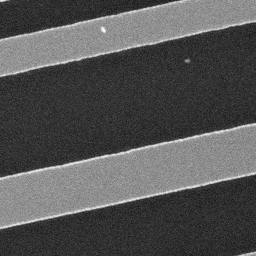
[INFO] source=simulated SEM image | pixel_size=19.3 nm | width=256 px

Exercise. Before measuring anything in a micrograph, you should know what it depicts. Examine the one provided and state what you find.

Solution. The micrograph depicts lines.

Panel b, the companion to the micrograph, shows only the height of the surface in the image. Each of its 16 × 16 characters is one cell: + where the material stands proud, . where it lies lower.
.........+++++++
.....++++++++++.
+++++++++++.....
++++++..........
+...............
................
................
................
............++++
........++++++++
...+++++++++++++
+++++++++++++...
++++++++........
++++............
................
................